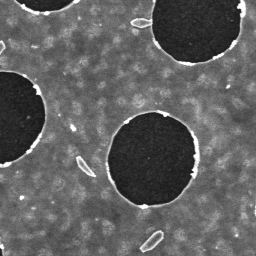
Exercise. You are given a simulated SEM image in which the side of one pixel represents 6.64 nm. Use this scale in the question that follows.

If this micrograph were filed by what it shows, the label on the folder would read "holes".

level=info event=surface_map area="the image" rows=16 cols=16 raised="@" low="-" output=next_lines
@@--@@@@@@-----@
@@@@@@@@@@-----@
@@@@@@@@@@-----@
@@@@@@@@@@@---@@
-@@@@@@@@@@@@@@@
--@@@@@@@@@@@@@@
---@@@@@@@@@@@@@
---@@@@@---@@@@@
--@@@@@-----@@@@
--@@@@@-----@@@@
@@@@@@@-----@@@@
@@@@@@@-----@@@@
@@@@@@@@---@@@@@
@@@@@@@@@@@@@@@@
@@@@@@@@@@@@@@@@
@@@@@@@@@@@@@@@@